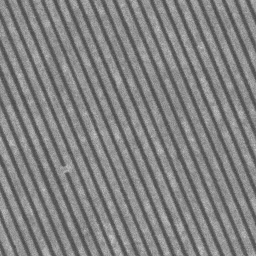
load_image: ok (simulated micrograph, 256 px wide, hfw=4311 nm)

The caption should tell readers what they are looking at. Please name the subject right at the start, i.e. parallel lines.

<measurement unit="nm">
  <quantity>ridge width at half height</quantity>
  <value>98.9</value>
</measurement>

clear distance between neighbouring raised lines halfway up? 83.4 nm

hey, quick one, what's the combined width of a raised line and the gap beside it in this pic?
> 0.187 µm